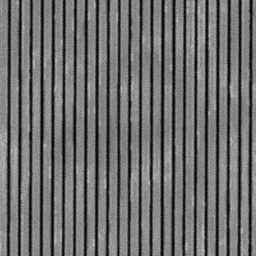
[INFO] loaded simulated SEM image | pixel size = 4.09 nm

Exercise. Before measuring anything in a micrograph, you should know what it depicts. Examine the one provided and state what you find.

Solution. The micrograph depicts parallel lines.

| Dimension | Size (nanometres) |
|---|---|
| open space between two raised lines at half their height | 10.7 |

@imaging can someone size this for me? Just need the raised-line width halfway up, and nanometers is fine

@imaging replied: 35.3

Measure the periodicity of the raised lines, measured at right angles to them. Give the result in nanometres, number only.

45